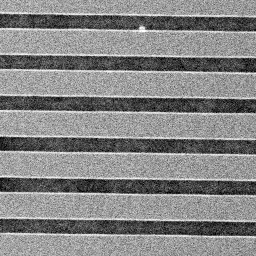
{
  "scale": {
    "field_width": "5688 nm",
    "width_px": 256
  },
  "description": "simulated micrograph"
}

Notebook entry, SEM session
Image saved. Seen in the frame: groups of lines, slits or small figures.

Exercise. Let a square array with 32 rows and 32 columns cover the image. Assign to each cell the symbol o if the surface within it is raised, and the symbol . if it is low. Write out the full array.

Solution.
oooooooooooooooooooooooooooooooo
oooooooooooooooooooooooooooooooo
................................
................................
oooooooooooooooooooooooooooooooo
oooooooooooooooooooooooooooooooo
oooooooooooooooooooooooooooooooo
................................
................................
oooooooooooooooooooooooooooooooo
oooooooooooooooooooooooooooooooo
oooooooooooooooooooooooooooooooo
................................
................................
oooooooooooooooooooooooooooooooo
oooooooooooooooooooooooooooooooo
oooooooooooooooooooooooooooooooo
................................
................................
oooooooooooooooooooooooooooooooo
oooooooooooooooooooooooooooooooo
oooooooooooooooooooooooooooooooo
................................
................................
oooooooooooooooooooooooooooooooo
oooooooooooooooooooooooooooooooo
oooooooooooooooooooooooooooooooo
...................ooooooooooooo
................................
ooooooooooooooooooooooo.........
oooooooooooooooooooooooooooooooo
oooooooooooooooooooooooooooooooo